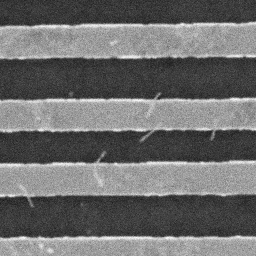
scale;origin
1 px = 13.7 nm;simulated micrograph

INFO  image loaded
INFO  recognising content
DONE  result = lines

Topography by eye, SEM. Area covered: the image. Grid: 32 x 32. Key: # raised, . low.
................................
................................
................................
################################
################################
################################
################################
................................
................................
................................
................................
................................
...................#.........###
################################
################################
################################
................................
................................
................................
................................
............#.....##############
################################
################################
################################
...#............................
................................
................................
................................
................................
................................
################################
################################